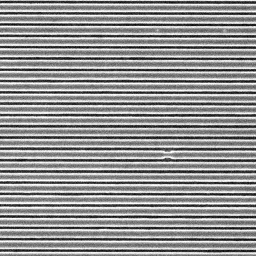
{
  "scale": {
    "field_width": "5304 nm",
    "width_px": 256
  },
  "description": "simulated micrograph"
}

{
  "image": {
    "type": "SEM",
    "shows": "parallel lines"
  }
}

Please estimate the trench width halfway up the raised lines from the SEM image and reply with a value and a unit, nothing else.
0.0777 um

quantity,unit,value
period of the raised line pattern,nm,234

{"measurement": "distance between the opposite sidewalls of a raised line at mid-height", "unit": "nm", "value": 158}